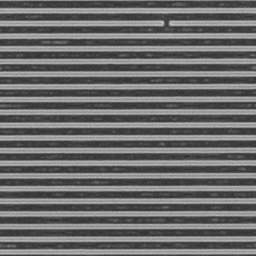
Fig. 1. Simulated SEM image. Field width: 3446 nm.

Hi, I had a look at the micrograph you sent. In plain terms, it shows parallel lines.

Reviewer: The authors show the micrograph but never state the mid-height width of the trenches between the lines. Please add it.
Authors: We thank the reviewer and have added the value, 8.63 px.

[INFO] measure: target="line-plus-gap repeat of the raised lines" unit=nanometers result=171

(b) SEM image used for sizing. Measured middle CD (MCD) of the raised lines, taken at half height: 4.38 pixels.